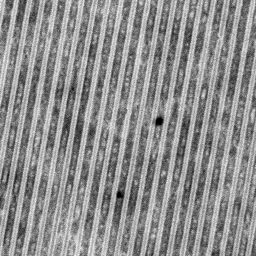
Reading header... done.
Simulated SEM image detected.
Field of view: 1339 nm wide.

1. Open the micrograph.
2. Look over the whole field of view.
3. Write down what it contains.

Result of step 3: parallel lines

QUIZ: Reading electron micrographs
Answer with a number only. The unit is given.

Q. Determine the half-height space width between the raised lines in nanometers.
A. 41.2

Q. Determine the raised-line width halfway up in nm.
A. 23.1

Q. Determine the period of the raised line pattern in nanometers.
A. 67.8